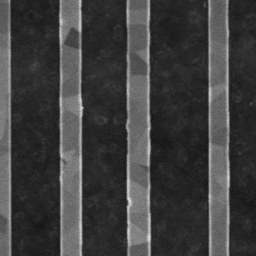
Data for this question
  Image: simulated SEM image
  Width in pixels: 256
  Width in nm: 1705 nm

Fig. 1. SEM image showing one or a few lines or trenches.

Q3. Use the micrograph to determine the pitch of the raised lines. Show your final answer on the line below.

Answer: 0.493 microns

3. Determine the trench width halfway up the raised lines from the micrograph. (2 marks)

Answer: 338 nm